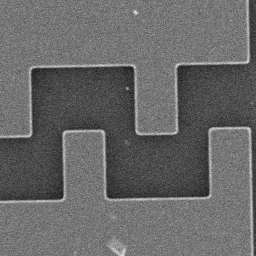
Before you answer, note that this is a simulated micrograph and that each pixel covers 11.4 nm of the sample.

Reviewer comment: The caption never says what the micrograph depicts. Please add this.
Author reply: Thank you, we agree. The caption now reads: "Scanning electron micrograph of groups of lines, slits or small figures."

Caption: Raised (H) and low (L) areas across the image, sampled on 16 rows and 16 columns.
HHHHHHHHHHHHHHHL
HHHHHHHHHHHHHHHH
HHHHHHHHHHHHHHHH
HHHHHHHHHHHHHHHH
HHLLLLLLHHHLLLLL
HHLLLLLLHHHLLLLL
HHLLLLLLHHHLLLLL
HHLLLLLLHHHLLLLL
HHLLHHLLLLLLLHHH
LLLLHHHLLLLLLHHH
LLLLHHHLLLLLLHHH
LLLLHHHLLLLLLHHH
LLLLHHHHHHHHHHHH
HHHHHHHHHHHHHHHH
HHHHHHHHHHHHHHHH
HHHHHHHHHHHHHHHH